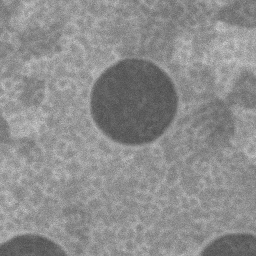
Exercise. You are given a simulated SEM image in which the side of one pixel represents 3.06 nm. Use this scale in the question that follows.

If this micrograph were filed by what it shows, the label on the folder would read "holes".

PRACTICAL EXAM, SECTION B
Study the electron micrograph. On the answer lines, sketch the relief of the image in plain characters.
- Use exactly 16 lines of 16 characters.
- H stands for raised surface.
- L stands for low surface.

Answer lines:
HHHHHHHHHHHHHHHH
HHHHHHHHHHHHHHHH
HHHHHHHHHHHHHHHH
HHHHHHHHHHHHHHHH
HHHHHHLLLLHHHHHH
HHHHHHLLLLLHHHHH
HHHHHHLLLLLHHHHH
HHHHHHLLLLLHHHHH
HHHHHHHLLLHHHHHH
HHHHHHHHHHHHHHHH
HHHHHHHHHHHHHHHH
HHHHHHHHHHHHHHHH
HHHHHHHHHHHHHHHH
HHHHHHHHHHHHHHHH
HHHHHHHHHHHHHHHH
LLLLHHHHHHHHHLLL